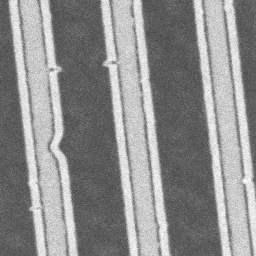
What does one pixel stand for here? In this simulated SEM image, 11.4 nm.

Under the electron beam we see one or a few lines or trenches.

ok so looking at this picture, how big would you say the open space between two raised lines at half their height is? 0.342 microns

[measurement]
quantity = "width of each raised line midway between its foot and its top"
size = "61.7 pixels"